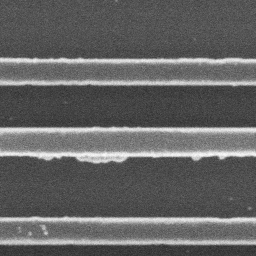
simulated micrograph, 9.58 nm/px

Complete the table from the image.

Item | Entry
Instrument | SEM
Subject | lines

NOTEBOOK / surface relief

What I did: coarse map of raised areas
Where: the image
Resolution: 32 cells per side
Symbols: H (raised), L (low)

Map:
LLLLLLLLLLLLLLLLLLLLLLLLLLLLLLLL
LLLLLLLLLLLLLLLLLLLLLLLLLLLLLLLL
LLLLLLLLLLLLLLLLLLLLLLLLLLLLLLLL
LLLLLLLLLLLLLLLLLLLLLLLLLLLLLLLL
LLLLLLLLLLLLLLLLLLLLLLLLLLLLLLLL
LLLLLLLLLLLLLLLLLLLLLLLLLLLLLLLL
LLLLLLLLLLLLLLLLLLLLLLLLLLLLLLLL
HHHHHHHHHHHHHHHHHHHHHHHHHHHHHHHH
HHHHHHHHHHHHHHHHHHHHHHHHHHHHHHHH
HHHHHHHHHHHHHHHHHHHHHHHHHHHHHHHH
LHHLHHHLLLLLLHHHHHHHHHHHHHHHHHHH
LLLLLLLLLLLLLLLLLLLLLLLLLLLLLLLL
LLLLLLLLLLLLLLLLLLLLLLLLLLLLLLLL
LLLLLLLLLLLLLLLLLLLLLLLLLLLLLLLL
LLLLLLLLLLLLLLLLLLLLLLLLLLLLLLLL
LLLLLLLLLLLLLLLLLLLLLLLLLLLLLLLL
HHHHHHHHHHHHHHHHHHHHHHHHHHHHHHHH
HHHHHHHHHHHHHHHHHHHHHHHHHHHHHHHH
HHHHHHHHHHHHHHHHHHHHHHHHHHHHHHHH
LLLLHHHLLLLLHHLHHHHHHHHHLHLLLLLL
LLLLLLLLLLLLLLLLLLLLLLLLLLLLLLLL
LLLLLLLLLLLLLLLLLLLLLLLLLLLLLLLL
LLLLLLLLLLLLLLLLLLLLLLLLLLLLLLLL
LLLLLLLLLLLLLLLLLLLLLLLLLLLLLLLL
LLLLLLLLLLLLLLLLLLLLLLLLLLLLLLLL
LLLLLLLLLLLLLLLLLLLLLLLLLLLLLLLL
LLLLLLLLLLLLLLLLLLLLLLLLLLLLLLLL
HHHHHHHHHHHHHHHHHHHHHHHHHHHHHHHH
HHHHHHHHHHHHHHHHHHHHHHHHHHHHHHHH
HHHHHHHHHHHHHHHHHHHHHHHHHHHHHHHH
LLLLHHHLLLLHHHHHLHLLLHHHHHHHHHHH
LLLLLLLLLLLLLLLLLLLLLLLLLLLLLLLL